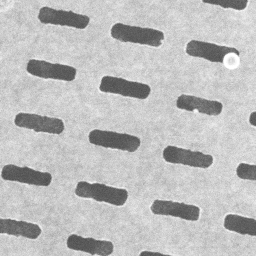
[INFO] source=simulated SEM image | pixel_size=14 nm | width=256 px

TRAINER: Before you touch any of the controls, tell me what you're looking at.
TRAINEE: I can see a regular array of holes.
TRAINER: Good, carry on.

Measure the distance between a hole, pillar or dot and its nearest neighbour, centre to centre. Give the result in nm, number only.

752